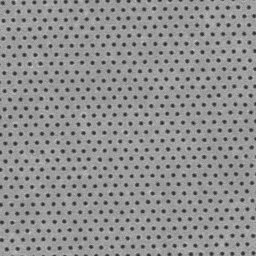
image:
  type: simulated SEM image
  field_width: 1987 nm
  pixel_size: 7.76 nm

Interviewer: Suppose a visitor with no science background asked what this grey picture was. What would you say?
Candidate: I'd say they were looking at a regular array of holes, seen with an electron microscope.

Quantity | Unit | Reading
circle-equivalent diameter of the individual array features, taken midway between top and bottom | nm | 33.9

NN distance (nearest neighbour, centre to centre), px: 9.69